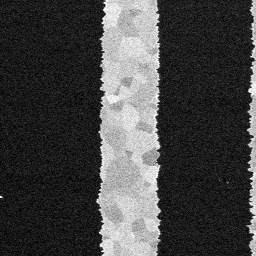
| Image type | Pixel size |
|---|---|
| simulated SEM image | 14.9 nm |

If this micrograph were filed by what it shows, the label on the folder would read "one or a few lines or trenches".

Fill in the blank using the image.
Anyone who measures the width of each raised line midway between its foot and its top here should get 823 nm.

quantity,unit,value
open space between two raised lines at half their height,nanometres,1420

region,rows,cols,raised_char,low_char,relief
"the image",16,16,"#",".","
.......###......
......####......
......####......
......####......
......####......
......####......
......####......
......####......
......####......
......####......
......####......
......####......
......####......
......####......
......####......
......####......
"